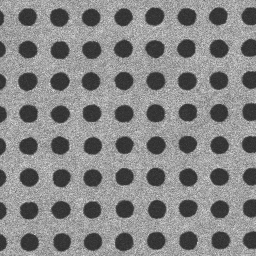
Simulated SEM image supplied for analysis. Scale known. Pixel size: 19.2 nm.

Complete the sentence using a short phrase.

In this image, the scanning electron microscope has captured a regular array of holes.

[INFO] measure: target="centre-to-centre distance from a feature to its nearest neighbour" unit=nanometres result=604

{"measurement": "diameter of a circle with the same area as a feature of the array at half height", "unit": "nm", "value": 355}